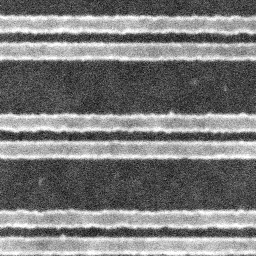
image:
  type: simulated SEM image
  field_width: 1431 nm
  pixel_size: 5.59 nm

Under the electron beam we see lines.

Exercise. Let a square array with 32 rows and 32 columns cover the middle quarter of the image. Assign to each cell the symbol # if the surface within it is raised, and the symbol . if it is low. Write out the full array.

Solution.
................................
................................
................................
................................
................................
................................
................................
................................
................................
................................
................................
................................
................................
################################
################################
################################
######.######.###.##.###########
................................
................................
............##..................
################################
################################
################################
................................
................................
................................
................................
................................
................................
................................
................................
................................